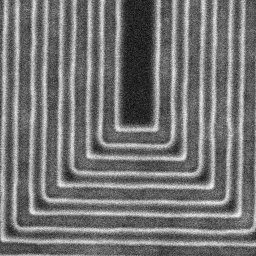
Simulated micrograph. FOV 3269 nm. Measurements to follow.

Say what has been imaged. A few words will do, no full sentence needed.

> groups of lines, slits or small figures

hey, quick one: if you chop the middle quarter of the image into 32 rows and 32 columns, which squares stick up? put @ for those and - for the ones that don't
@@----@@@@---@@@@@@@@@@----@@@@-
@@----@@@@---@@@@@@@@@@----@@@@-
@@----@@@@---@@@@@@@@@@----@@@@-
@@----@@@@---@@@@@@@@@@----@@@@-
@@----@@@@---@@@@@@@@@@@---@@@@-
@@----@@@@---@@@@@@@@@@@---@@@--
@@----@@@@---@@@@@@@@@@@---@@@--
@@----@@@@---@@@@@@@@@@@---@@@--
@@----@@@@---@@@@@@@@@@@---@@@--
@@----@@@@---@@@@@@@@@@@---@@@--
@@----@@@@---@@@@@@@@@@@---@@@--
@@----@@@----@@@@@@@@@@@---@@@--
@@----@@@----@@@@@@@@@@----@@@--
@@----@@@----@@@@@@@@@@----@@@--
@@----@@@----@@@@@@@@@@----@@@--
@@----@@@----@@@@@@@@@@----@@@--
@@----@@@----@@@@@@@@@@----@@@--
@@----@@@------------------@@@--
@@----@@@------------------@@@--
@@----@@@@----------------@@@@--
@@----@@@@@@@@@@@@@@@@@@@@@@@@--
@@----@@@@@@@@@@@@@@@@@@@@@@@@--
@@----@@@@@@@@@@@@@@@@@@@@@@@@--
@@-------@@@@@@@@@@@@@@@@@@@@@--
@@------------------------------
@@------------------------------
@@@-----------------------------
@@@@@@@@@@@@@@@@@@@@@@@@@@@@@@@@
@@@@@@@@@@@@@@@@@@@@@@@@@@@@@@@@
@@@@@@@@@@@@@@@@@@@@@@@@@@@@@@@@
@@@-----@@@@@@@@@@@@@@@@@@@@@@@@
--------------------------------